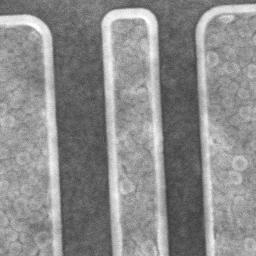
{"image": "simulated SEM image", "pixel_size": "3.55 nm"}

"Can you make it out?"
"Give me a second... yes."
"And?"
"one or a few lines or trenches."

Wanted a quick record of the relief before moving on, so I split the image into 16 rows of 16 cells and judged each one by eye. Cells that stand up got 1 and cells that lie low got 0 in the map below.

0000000000000011
1100000111000111
1110000111001111
1110000111001111
1110000111000111
1110000111000111
1110000111000111
1110000111000111
1110000111000111
1110000111000111
1110000111000111
1110000111000111
1111000111000111
1111000111000111
1111000111000111
1111000111000111